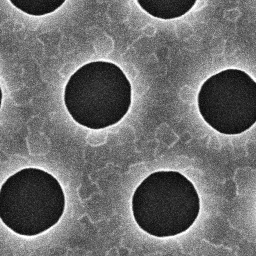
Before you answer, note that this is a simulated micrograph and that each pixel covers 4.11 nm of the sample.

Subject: holes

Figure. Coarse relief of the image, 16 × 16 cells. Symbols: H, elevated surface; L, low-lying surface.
HLLLHHHHHLLLHHHH
HHHHHHHHHHHHHHHH
HHHHHHHHHHHHHHHH
HHHHHHHHHHHHHHHH
HHHHHLLLHHHHHHLH
HHHHLLLLHHHHHLLL
HHHHLLLLHHHHLLLL
HHHHHLLHHHHHHLLL
HHHHHHHHHHHHHHHH
HHHHHHHHHHHHHHHH
HHHHHHHHHHHHHHHH
LLLLHHHHHLLLHHHH
LLLLHHHHLLLLHHHH
LLLLHHHHLLLLHHHH
HLLHHHHHHLLHHHHH
HHHHHHHHHHHHHHHH